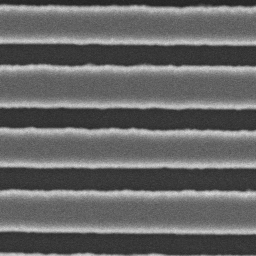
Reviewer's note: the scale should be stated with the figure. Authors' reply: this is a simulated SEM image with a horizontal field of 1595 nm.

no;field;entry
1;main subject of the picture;lines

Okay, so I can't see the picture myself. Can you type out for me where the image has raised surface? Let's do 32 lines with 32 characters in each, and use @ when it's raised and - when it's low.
--------------------------------
@@@@@@@@@@@@@@@@@@@@@@@@@@@@@@@@
@@@@@@@@@@@@@@@@@@@@@@@@@@@@@@@@
@@@@@@@@@@@@@@@@@@@@@@@@@@@@@@@@
@@@@@@@@@@@@@@@@@@@@@@@@@@@@@@@@
---------@@--@@@@@@@@@@@@@@@@@@@
--------------------------------
--------------------------------
@@@@@@@@@@@@@@@@@@@@@@@@@@@@@@@@
@@@@@@@@@@@@@@@@@@@@@@@@@@@@@@@@
@@@@@@@@@@@@@@@@@@@@@@@@@@@@@@@@
@@@@@@@@@@@@@@@@@@@@@@@@@@@@@@@@
@@@@@@@@@@@@@@@@@@@@@@@@@@@@@@@@
---------------------@@@-@@@@@@@
--------------------------------
--------------------------------
@@@@@@@@@@@@@@@@@@@@@@@@@@@@@@@@
@@@@@@@@@@@@@@@@@@@@@@@@@@@@@@@@
@@@@@@@@@@@@@@@@@@@@@@@@@@@@@@@@
@@@@@@@@@@@@@@@@@@@@@@@@@@@@@@@@
@@@@@@@@@@@@@@@@@@@@@@@@@@@@@@@@
--------------------------------
--------------------------------
--------------------------------
@@@@@@@@@@@@@@@@@@@@@@@@@@@@@@@@
@@@@@@@@@@@@@@@@@@@@@@@@@@@@@@@@
@@@@@@@@@@@@@@@@@@@@@@@@@@@@@@@@
@@@@@@@@@@@@@@@@@@@@@@@@@@@@@@@@
@@@@@@@@@@@@@@@@@@@@@@@@@@@@@@@@
--------------------------------
--------------------------------
--------------------------------